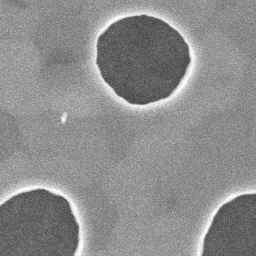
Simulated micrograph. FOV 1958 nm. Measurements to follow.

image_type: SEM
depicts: holes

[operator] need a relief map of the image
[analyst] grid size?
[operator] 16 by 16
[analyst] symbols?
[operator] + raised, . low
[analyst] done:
++++++++++++++++
+++++++...++++++
++++++......++++
++++++......++++
++++++......++++
+++++++....+++++
++++++++.+++++++
++++++++++++++++
++++++++++++++++
++++++++++++++++
++++++++++++++++
++++++++++++++++
....++++++++++..
.....++++++++...
.....++++++++...
.....++++++++...